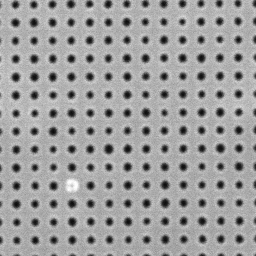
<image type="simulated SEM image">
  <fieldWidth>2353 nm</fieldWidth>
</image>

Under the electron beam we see a regular array of holes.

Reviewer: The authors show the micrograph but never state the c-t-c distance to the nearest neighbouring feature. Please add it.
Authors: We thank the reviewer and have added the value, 166 nm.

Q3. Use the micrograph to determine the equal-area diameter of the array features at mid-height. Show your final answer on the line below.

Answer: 83.3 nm